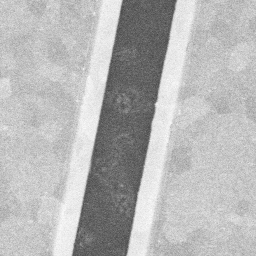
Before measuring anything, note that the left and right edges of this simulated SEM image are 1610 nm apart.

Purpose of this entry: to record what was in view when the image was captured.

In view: one or a few lines or trenches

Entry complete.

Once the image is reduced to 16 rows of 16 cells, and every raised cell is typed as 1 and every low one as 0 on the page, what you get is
1111111000001111
1111111000011111
1111110000011111
1111110000011111
1111110000011111
1111110000011111
1111110000111111
1111100000111111
1111100000111111
1111100000111111
1111100000111111
1111100001111111
1111100001111111
1111000001111111
1111000001111111
1111000001111111